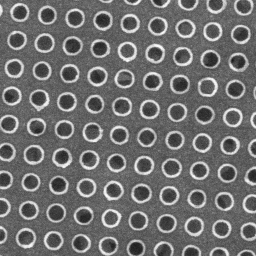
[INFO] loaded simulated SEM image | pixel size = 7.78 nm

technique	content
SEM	a regular array of raised bodies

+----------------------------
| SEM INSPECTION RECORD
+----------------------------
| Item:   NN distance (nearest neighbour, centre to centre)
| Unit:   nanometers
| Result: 214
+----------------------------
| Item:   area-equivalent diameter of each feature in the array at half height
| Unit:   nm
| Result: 141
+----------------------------